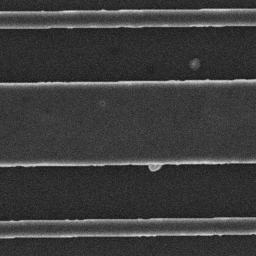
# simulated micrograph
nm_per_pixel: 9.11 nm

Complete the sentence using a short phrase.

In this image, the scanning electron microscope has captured lines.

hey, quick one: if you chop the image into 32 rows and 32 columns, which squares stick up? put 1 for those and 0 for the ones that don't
00000000000000000000000000000000
00000001111111111111111111111111
11111111111111111111111111111111
11111110110000000000000000000000
00000000000000000000000000000000
00000000000000000000000000000000
00000000000000000000000000000000
00000000000000000000000000000000
00000000000000000000000000000000
00000000000000000000000000000000
11111111111111111111111111111111
11111111111111111111111111111111
11111111111111111111111111111111
11111111111111111111111111111111
11111111111111111111111111111111
11111111111111111111111111111111
11111111111111111111111111111111
11111111111111111111111111111111
11111111111111111111111111111111
11111111111111111111111111111111
11111111111111111110100000000000
00000000000000000000000000000000
00000000000000000000000000000000
00000000000000000000000000000000
00000000000000000000000000000000
00000000000000000000000000000000
00000000000000000000000000000000
00000000111111111111111111111111
11111111111111111111111111111111
11111111110000000000000000000000
00000000000000000000000000000000
00000000000000000000000000000000